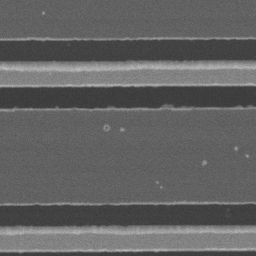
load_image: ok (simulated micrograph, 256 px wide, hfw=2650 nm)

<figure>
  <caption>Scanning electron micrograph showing lines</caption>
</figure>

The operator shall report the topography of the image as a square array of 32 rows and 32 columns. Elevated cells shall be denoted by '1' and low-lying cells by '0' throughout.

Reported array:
11111111111111111111111111111111
11111111111111111111111111111111
11111111111111111111111111111111
11111111111111111111111111111111
11111111111111111111111111111111
00000000000000000000000000000000
00000000000000000000000000000000
00000000000000000000000000000000
11111111111111111111111111111111
11111111111111111111111111111111
11111111111111111111111111111111
00000000000000000000000000000000
00000000000000000000000000000000
00000000000000000010110111111111
11111111111111111111111111111111
11111111111111111111111111111111
11111111111111111111111111111111
11111111111111111111111111111111
11111111111111111111111111111111
11111111111111111111111111111111
11111111111111111111111111111111
11111111111111111111111111111111
11111111111111111111111111111111
11111111111111111111111111111111
11111111111111111111111111111111
11111111111111100001000000000000
00000000000000000000000000000000
00000000000000000000000000000000
00110100101111101111111111111111
11111111111111111111111111111111
11111111111111111111111111111111
00000000000000000000000000000000